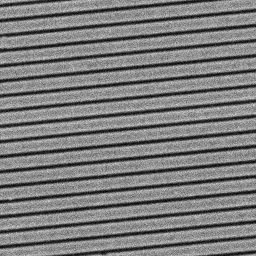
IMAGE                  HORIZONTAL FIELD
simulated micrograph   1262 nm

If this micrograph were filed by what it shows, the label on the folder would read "parallel lines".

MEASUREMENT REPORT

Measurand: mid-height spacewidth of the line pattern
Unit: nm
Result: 19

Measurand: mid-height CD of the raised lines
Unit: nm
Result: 57.6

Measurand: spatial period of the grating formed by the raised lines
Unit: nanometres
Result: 74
